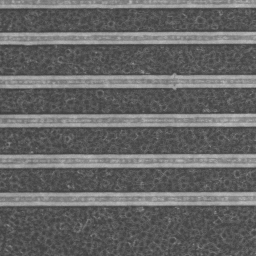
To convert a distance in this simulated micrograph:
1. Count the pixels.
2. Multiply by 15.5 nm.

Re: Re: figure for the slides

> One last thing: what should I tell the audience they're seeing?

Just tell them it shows parallel lines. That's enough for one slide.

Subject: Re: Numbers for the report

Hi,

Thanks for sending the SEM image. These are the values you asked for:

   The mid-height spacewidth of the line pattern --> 466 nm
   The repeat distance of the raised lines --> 0.624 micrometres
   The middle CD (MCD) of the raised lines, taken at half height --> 8.99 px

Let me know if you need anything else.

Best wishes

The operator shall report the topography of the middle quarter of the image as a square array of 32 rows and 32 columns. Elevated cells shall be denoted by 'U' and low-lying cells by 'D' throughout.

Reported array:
DDDDDDDDDDDDDDDDDDDDDDDDDDDDDDDD
DDDDDDDDDDDDDDDDDDDDDDDDDDDDDDDD
DDDDDDDDDDDDDDDDDDDDDDDDDDDDDDDD
UUUUUUUUUUUUUUUUUUUUUUUUUUUUUUUU
UUUUUUUUUUUUUUUUUUUUUUUUUUUUUUUU
DDDDDDDDDDDDDDDDDDDDDDDDDDDUUDDD
DDDDDDDDDDDDDDDDDDDDDDDDDDDDDDDD
DDDDDDDDDDDDDDDDDDDDDDDDDDDDDDDD
DDDDDDDDDDDDDDDDDDDDDDDDDDDDDDDD
DDDDDDDDDDDDDDDDDDDDDDDDDDDDDDDD
DDDDDDDDDDDDDDDDDDDDDDDDDDDDDDDD
DDDDDDDDDDDDDDDDDDDDDDDDDDDDDDDD
DDDDDDDDDDDDDDDDDDDDDDDDDDDDDDDD
UUUUUUUUUUUUUUUUUUUUUUUUUUUUUUUU
UUUUUUUUUUUUUUUUUUUUUUUUUUUUUUUU
DDDDDDDDDDDDDDDDDDDDDDDDDDDDDDDD
DDDDDDDDDDDDDDDDDDDDDDDDDDDDDDDD
DDDDDDDDDDDDDDDDDDDDDDDDDDDDDDDD
DDDDDDDDDDDDDDDDDDDDDDDDDDDDDDDD
DDDDDDDDDDDDDDDDDDDDDDDDDDDDDDDD
DDDDDDDDDDDDDDDDDDDDDDDDDDDDDDDD
DDDDDDDDDDDDDDDDDDDDDDDDDDDDDDDD
DDDDDDDDDDDDDDDDDDDDDDDDDDDDDDDD
UUUUUUUUUUUUUUUUUUUUUUUUUUUUUUUU
UUUUUUUUUUUUUUUUUUUUUUUUUUUUUUUU
DDDDDDDDDDDDDDDDDDDDDDDDDDDDDDDD
DDDDDDDDDDDDDDDDDDDDDDDDDDDDDDDD
DDDDDDDDDDDDDDDDDDDDDDDDDDDDDDDD
DDDDDDDDDDDDDDDDDDDDDDDDDDDDDDDD
DDDDDDDDDDDDDDDDDDDDDDDDDDDDDDDD
DDDDDDDDDDDDDDDDDDDDDDDDDDDDDDDD
DDDDDDDDDDDDDDDDDDDDDDDDDDDDDDDD